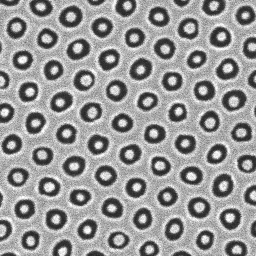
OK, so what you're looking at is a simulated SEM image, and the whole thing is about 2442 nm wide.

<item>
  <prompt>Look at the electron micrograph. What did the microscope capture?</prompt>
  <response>a regular array of ring-shaped grooves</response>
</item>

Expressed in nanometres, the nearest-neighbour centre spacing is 303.